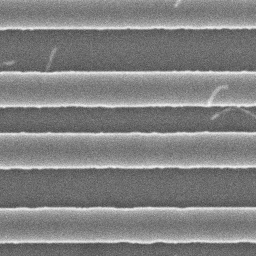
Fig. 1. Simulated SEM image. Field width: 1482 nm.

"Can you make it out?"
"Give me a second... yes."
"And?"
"lines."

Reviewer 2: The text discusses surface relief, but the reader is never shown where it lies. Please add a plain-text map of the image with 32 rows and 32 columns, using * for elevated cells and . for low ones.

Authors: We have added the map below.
********************************
********************************
********************************
********************************
................................
................................
................................
................................
................................
********************************
********************************
********************************
********************************
................................
................................
................................
................................
********************************
********************************
********************************
********************************
................................
................................
................................
................................
................................
********************************
********************************
********************************
********************************
................................
................................